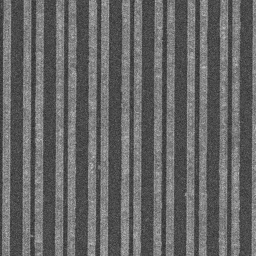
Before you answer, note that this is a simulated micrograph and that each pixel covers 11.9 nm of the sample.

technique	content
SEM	parallel lines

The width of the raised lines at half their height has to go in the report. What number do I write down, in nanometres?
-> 80.6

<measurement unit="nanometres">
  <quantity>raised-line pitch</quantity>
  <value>196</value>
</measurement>